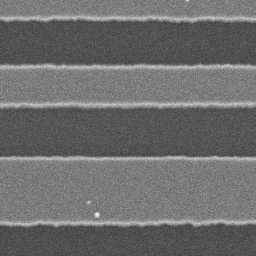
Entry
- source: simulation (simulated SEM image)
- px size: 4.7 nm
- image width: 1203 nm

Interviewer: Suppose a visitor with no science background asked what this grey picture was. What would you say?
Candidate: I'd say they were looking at lines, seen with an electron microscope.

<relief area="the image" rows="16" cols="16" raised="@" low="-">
@@@@@@@@@@@@@@@@
----------------
----------------
----------------
@@@@@@@@@@@@@@@@
@@@@@@@@@@@@@@@@
@@@@@@@@@@@@@@@@
----------------
----------------
----------------
@@@@@@@@@@@@@@@@
@@@@@@@@@@@@@@@@
@@@@@@@@@@@@@@@@
@@@@@@@@@@@@@@@@
----------------
----------------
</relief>